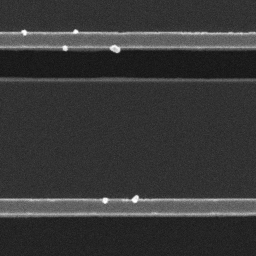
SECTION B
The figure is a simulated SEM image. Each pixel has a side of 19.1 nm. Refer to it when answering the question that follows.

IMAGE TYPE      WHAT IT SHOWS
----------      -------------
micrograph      lines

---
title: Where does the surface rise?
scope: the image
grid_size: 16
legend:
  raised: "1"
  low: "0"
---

1111111111111111
1111111111111111
1111111111111111
0000000000000000
0000000000000000
1111111111111111
1111111111111111
1111111111111111
1111111111111111
1111111111111111
1111111111111111
1111111111111111
1111111111111111
0000000000000000
0000000000000000
0000000000000000